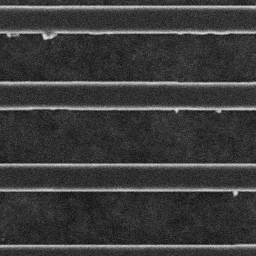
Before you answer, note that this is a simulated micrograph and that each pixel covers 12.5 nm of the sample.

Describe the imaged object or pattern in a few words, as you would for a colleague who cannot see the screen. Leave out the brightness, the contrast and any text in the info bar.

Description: lines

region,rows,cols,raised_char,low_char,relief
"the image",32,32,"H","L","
LLLLLLLLLLLLLLLLLLLLLLLLLLLLLLLL
HHHHHHHHHHHHHHHHHHHHHHHHHHHHHHHH
HHHHHHHHHHHHHHHHHHHHHHHHHHHHHHHH
HHHHHHHHHHHHHHHHHHHHHHHHHHHHHHHH
LLLLLHHLLLLLLLLLLLLLLLLLLLLLLLLL
LLLLLLLLLLLLLLLLLLLLLLLLLLLLLLLL
LLLLLLLLLLLLLLLLLLLLLLLLLLLLLLLL
LLLLLLLLLLLLLLLLLLLLLLLLLLLLLLLL
LLLLLLLLLLLLLLLLLLLLLLLLLLLLLLLL
LLLLLLLLLLLLLLLLLLLLLLLLLLLLLLLL
HHHHHHHHHHHHHHHHHHHHHHHHHHHHHHHH
HHHHHHHHHHHHHHHHHHHHHHHHHHHHHHHH
HHHHHHHHHHHHHHHHHHHHHHHHHHHHHHHH
HHHHHHHHHHHHHHHHHHHHHHHHHHHHHHHH
LLLLLLLLLLLLLLLLLLLLLLLLLLLLLLLL
LLLLLLLLLLLLLLLLLLLLLLLLLLLLLLLL
LLLLLLLLLLLLLLLLLLLLLLLLLLLLLLLL
LLLLLLLLLLLLLLLLLLLLLLLLLLLLLLLL
LLLLLLLLLLLLLLLLLLLLLLLLLLLLLLLL
LLLLLLLLLLLLLLLLLLLLLLLLLLLLLLLL
LLLLLLLLLLLLLLLLLLLLLLLLLLLLLLLL
HHHHHHHHHHHHHHHHHHHHHHHHHHHHHHHH
HHHHHHHHHHHHHHHHHHHHHHHHHHHHHHHH
HHHHHHHHHHHHHHHHHHHHHHHHHHHHHHHH
LLLLLLLLLLLLLLLLLLLLLLLLLLLLLLLL
LLLLLLLLLLLLLLLLLLLLLLLLLLLLLLLL
LLLLLLLLLLLLLLLLLLLLLLLLLLLLLLLL
LLLLLLLLLLLLLLLLLLLLLLLLLLLLLLLL
LLLLLLLLLLLLLLLLLLLLLLLLLLLLLLLL
LLLLLLLLLLLLLLLLLLLLLLLLLLLLLLLL
LLLLLLLLLLLLLLLLLLLLLLLLLLLLLLLL
HHHHHHHHHHHHHHHHHHHHHHHHHHHHHHHH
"